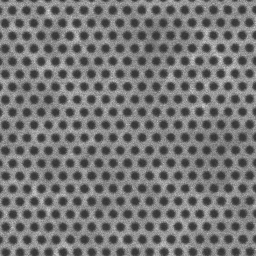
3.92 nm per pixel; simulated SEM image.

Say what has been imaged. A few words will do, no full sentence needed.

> a regular array of holes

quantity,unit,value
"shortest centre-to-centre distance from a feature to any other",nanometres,55.9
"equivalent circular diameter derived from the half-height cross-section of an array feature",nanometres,37.5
